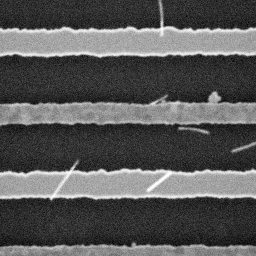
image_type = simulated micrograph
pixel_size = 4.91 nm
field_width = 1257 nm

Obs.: lines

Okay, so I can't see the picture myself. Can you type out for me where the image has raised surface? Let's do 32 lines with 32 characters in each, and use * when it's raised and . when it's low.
................................
................................
................................
................*...**..........
********************************
********************************
********************************
................................
................................
................................
................................
................................
................................
********************************
********************************
*..*....*...*.....*...**........
................................
................................
................................
................................
................................
....*...**..*.********...*****.*
********************************
********************************
********************************
................................
................................
................................
................................
................................
................................
********************************